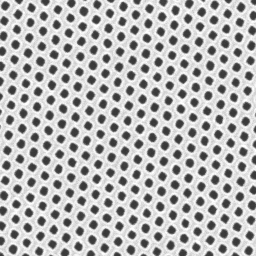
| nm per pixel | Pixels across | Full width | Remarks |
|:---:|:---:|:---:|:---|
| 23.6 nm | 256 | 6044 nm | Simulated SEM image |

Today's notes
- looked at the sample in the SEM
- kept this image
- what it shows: a regular array of holes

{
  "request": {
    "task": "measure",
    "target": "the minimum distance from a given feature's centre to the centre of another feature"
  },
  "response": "0.35 um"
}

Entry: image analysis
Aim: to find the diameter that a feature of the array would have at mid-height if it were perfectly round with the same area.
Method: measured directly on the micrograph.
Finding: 229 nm